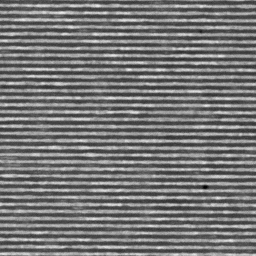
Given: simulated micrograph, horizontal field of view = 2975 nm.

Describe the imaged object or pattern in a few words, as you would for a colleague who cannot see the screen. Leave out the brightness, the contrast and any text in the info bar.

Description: parallel lines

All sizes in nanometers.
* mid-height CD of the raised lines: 20.3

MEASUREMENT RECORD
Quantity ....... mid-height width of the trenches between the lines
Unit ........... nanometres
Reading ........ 61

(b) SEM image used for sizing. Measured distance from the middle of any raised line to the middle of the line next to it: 82.4 nm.